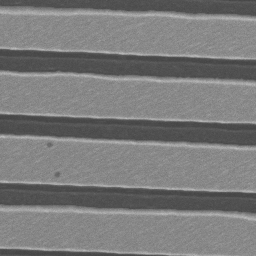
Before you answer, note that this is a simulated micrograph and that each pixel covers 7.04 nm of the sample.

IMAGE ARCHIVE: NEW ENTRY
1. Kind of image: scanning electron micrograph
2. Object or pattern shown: lines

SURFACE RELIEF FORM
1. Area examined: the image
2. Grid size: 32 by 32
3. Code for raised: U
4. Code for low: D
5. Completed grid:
DDDDDDDDDDDDDDDDDDDDDDDDDDDDDDDD
UUUUUUUUUUUUUUUUDDUUUDDDDDDDDDDD
UUUUUUUUUUUUUUUUUUUUUUUUUUUUUUUU
UUUUUUUUUUUUUUUUUUUUUUUUUUUUUUUU
UUUUUUUUUUUUUUUUUUUUUUUUUUUUUUUU
UUUUUUUUUUUUUUUUUUUUUUUUUUUUUUUU
DDDDDDDDDDUUUUUUUUUUUUUUUUUUUUUU
DDDDDDDDDDDDDDDDDDDDDDDDDDDDDDDD
DDDDDDDDDDDDDDDDDDDDDDDDDDDDDDDD
UUUUUUUUUUUUUUDDDDDDDDDDDDDDDDDD
UUUUUUUUUUUUUUUUUUUUUUUUUUUUUUUU
UUUUUUUUUUUUUUUUUUUUUUUUUUUUUUUU
UUUUUUUUUUUUUUUUUUUUUUUUUUUUUUUU
UUUUUUUUUUUUUUUUUUUUUUUUUUUUUUUU
DDDDDDDDUUUUUUUUUUUUUUUUUUUUUUUU
DDDDDDDDDDDDDDDDDDDDDDDDDDDDDDDD
DDDDDDDDDDDDDDDDDDDDDDDDDDDDDDDD
UUUUUUUUUUUUDDDDDDDDDDDDDDDDDDDD
UUUUUUUUUUUUUUUUUUUUUUUUUUUUUUUU
UUUUUUUUUUUUUUUUUUUUUUUUUUUUUUUU
UUUUUUUUUUUUUUUUUUUUUUUUUUUUUUUU
UUUUUUUUUUUUUUUUUUUUUUUUUUUUUUUU
UUUUUUUUUUUUUUUUUUUUUUUUUUUUUUUU
DDDDDDDDDDDDDDDDDDUUUUUUUUUUUUUU
DDDDDDDDDDDDDDDDDDDDDDDDDDDDDDDD
DDDDDDDDDDDDDDDDDDDDDDDDDDDDDDDD
UUUUUUUUUUUUUUUUUUUUUUUUUUUUDDDD
UUUUUUUUUUUUUUUUUUUUUUUUUUUUUUUU
UUUUUUUUUUUUUUUUUUUUUUUUUUUUUUUU
UUUUUUUUUUUUUUUUUUUUUUUUUUUUUUUU
UUUUUUUUUUUUUUUUUUUUUUUUUUUUUUUU
DDDDDDDDDDDDUUUUUUUUUUUUUUUUUUUU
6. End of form